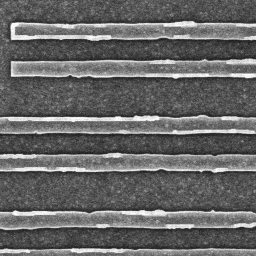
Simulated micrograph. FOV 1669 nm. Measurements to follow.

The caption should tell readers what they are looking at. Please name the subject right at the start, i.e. parallel lines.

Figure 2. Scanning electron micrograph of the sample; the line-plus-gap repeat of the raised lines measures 0.307 µm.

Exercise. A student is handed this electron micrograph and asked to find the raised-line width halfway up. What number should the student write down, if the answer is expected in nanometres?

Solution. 104